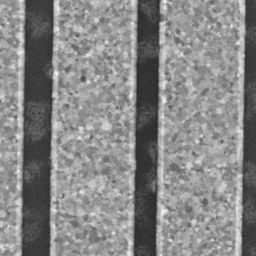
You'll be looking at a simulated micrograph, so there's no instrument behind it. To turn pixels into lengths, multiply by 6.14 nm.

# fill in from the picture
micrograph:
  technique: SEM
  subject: one or a few lines or trenches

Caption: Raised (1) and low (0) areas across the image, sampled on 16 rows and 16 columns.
1000111100111110
1000111100111110
1000111100111110
1001111100111110
1001111100111110
1001111100111110
1001111100111110
1001111100111110
1001111100111110
1001111100111110
1001111100111110
1001111100111110
1001111100111110
1001111100111110
1001111100111110
1001111100111110